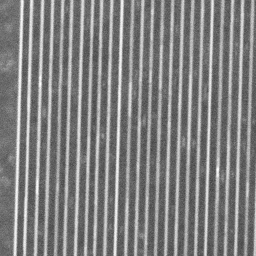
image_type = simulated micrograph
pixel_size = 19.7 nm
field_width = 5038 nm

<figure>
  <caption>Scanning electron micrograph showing parallel lines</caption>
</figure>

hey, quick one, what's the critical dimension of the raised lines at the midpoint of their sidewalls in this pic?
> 39.3 nm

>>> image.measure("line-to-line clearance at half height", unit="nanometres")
157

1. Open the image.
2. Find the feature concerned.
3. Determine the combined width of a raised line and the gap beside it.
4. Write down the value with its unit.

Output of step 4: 197 nm